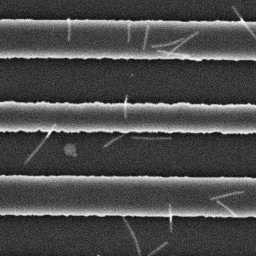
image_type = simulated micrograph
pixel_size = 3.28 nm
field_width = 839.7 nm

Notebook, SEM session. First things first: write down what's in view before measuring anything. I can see lines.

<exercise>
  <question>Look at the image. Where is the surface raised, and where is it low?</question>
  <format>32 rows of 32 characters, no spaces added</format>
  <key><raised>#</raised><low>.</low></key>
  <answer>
................................
................................
####....###.....................
################################
################################
################################
################################
........................#....#.#
................................
................................
................................
................................
................................
################################
################################
################################
...............#.....#..##.#####
................................
................................
................................
................................
................................
################################
################################
################################
################################
################################
................................
................................
................................
................................
................................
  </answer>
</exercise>